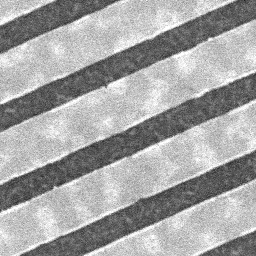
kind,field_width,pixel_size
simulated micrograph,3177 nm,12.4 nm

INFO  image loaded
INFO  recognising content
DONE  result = one or a few lines or trenches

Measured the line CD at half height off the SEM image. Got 559 nanometers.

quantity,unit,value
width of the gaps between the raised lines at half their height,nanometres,333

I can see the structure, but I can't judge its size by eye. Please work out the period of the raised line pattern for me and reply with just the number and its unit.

900 nm